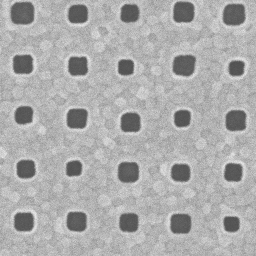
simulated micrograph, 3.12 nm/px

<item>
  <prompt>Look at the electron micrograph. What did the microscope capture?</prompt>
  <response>a regular array of holes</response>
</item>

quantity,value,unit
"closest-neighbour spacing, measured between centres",0.159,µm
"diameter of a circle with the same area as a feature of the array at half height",0.0637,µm